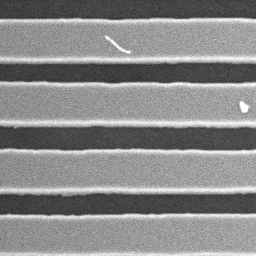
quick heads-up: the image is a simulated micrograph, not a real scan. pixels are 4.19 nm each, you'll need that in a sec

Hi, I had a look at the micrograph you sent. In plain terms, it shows lines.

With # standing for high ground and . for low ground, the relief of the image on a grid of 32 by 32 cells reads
................................
................................
##############.#################
################################
################################
################################
################################
################################
................................
................................
################################
################################
################################
################################
################################
################################
................................
................................
................................
################################
################################
################################
################################
################################
................................
................................
................................
################################
################################
################################
################################
################################